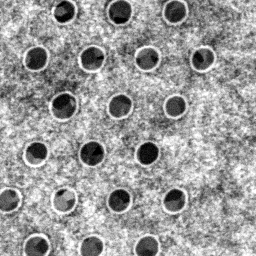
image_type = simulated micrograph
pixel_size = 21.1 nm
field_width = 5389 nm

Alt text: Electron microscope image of a regular array of raised bodies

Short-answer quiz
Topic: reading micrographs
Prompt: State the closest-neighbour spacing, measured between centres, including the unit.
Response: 1150 nm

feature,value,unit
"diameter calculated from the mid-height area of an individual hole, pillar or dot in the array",0.531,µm